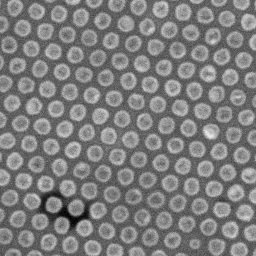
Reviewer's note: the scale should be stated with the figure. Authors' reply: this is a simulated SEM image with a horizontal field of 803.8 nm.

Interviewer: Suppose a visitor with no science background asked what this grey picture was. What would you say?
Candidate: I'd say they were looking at a regular array of raised bodies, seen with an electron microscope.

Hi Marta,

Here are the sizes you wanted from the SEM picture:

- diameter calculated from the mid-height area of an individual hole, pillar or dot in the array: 47.7 nm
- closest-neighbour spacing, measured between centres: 67.8 nanometres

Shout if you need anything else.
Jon